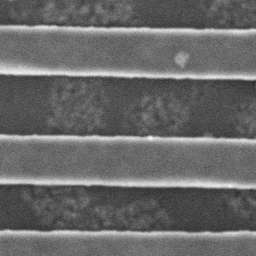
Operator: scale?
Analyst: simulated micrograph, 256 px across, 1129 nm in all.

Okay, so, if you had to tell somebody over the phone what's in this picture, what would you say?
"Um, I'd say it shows lines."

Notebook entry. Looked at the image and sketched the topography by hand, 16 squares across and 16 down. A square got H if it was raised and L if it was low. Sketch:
LLLLLLLLLLLLLLLL
LLLLLLLLLLLLLLLL
HHHHHHHHHHHHHHHH
HHHHHHHHHHHHHHHH
HHHHHHHHHHHHHHHH
LLLLLLLLLLLLLLLL
LLLLLLLLLLLLLLLL
LLLLLLLLLLLLLLLL
HLHLLLLLLLLLLLLL
HHHHHHHHHHHHHHHH
HHHHHHHHHHHHHHHH
LLHHHHHHHHHHHHHH
LLLLLLLLLLLLLLLL
LLLLLLLLLLLLLLLL
HHHHHHHHLLLLLLHH
HHHHHHHHHHHHHHHH